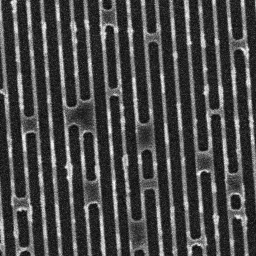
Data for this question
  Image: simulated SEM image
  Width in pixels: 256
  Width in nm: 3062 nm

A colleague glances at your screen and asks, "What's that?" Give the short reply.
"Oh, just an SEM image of parallel lines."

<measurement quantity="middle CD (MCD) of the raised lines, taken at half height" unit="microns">0.0328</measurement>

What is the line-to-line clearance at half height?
136 nanometres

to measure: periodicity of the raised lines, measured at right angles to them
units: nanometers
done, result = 170